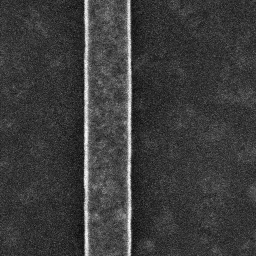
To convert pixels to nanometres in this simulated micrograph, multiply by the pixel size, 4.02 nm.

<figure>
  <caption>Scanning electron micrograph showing one or a few lines or trenches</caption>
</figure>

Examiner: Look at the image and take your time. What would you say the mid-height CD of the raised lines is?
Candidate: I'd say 0.177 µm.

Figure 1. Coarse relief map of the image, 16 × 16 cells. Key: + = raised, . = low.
.....+++........
.....+++........
.....+++........
.....+++........
.....+++........
.....+++........
.....+++........
.....+++........
.....+++........
.....+++........
.....+++........
.....+++........
.....+++........
.....+++........
.....+++........
.....+++........